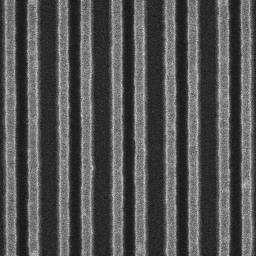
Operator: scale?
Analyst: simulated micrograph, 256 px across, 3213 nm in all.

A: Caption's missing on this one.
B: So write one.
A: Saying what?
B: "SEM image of parallel lines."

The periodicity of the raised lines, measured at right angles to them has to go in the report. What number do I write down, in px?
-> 26.2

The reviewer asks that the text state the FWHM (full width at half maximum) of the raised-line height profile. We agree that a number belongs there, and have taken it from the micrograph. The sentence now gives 146 nanometers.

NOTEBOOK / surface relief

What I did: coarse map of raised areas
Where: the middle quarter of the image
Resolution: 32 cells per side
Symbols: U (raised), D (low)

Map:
UDDDUUUDDDDDUUUDDDUUDDDDDUUUDDDU
UDDDUUUDDDDDUUUDDDUUDDDDDUUUDDDU
UDDDUUUDDDDDUUUDDDUUDDDDDUUUDDDU
UDDDUUUDDDDDUUUDDUUUDDDDDUUUDDDU
UDDDUUUDDDDDUUUDDUUUDDDDDUUUDDDU
UDDDUUUDDDDDUUUDDDUUDDDDDUUUDDDU
UDDDUUUDDDDDUUUDDDUUDDDDDUUUDDDU
UDDDUUUDDDDDUUUDDUUUDDDDDUUUDDDU
UDDDUUUDDDDDUUUDDUUUDDDDDUUUDDDU
UDDDUUUDDDDDUUUDDUUUDDDDDUUUDDDU
UUDDUUUDDDDDUUUDDUUUDDDDDUUUDDDU
UUDDUUUDDDDDUUUDDUUUDDDDDUUUDDDU
UDDDUUUDDDDDUUUDDUUUDDDDDUUUDDDU
UDDDUUUDDDDDUUUDDUUUDDDDDUUUDDDU
UDDDUUUDDDDDUUUDDUUUDDDDDUUUDDDU
UDDDUUUDDDDDUUUDDUUUDDDDDUUUDDDU
UDDDUUUDDDDDUUUDDUUUDDDDDUUUDDDU
UDDDUUUDDDDDUUUDDUUUDDDDDUUUDDDU
UDDDUUUDDDDDUUUDDUUUDDDDDUUUDDDU
UDDDUUUDDDDDUUUDDDUUDDDDDUUUDDDU
UDDDUUUDDDDDUUUDDDUUDDDDDUUUDDDU
UDDDUUUDDDDDUUUDDDUUUDDDDUUUDDDU
UDDDUUUDDDDDUUUDDDUUUDDDDUUUDDDU
UDDDUUUDDDDDUUUDDUUUUDDDDUUUDDDU
UDDDUUUDDDDDUUUDDUUUDDDDDUUUDDDU
UDDDUUUDDDDDUUUDDUUUDDDDDUUUDDDU
UDDDUUUDDDDDUUUDDUUUDDDDDUUUDDDU
UDDDUUUDDDDDUUUDDUUUUDDDDUUUDDDU
UDDDUUUDDDDDUUUDDUUUUDDDDUUUDDDU
UDDDUUUDDDDDUUUDDUUUDDDDDUUUDDDU
UDDDUUUDDDDDUUUDDUUUUDDDDUUUDDDU
UDDDUUUDDDDDUUUDDDUUDDDDDUUUDDDU